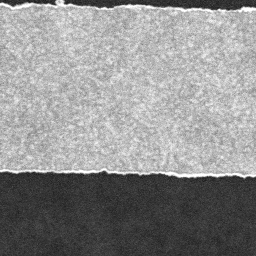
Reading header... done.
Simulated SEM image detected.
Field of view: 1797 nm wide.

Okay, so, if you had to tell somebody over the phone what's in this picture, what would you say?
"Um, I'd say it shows one or a few lines or trenches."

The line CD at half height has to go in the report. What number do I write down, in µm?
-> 1.16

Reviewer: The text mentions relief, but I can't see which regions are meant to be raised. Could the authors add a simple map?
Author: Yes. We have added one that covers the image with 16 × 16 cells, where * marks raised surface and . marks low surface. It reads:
******.****.....
****************
****************
****************
****************
****************
****************
****************
****************
****************
****************
................
................
................
................
................